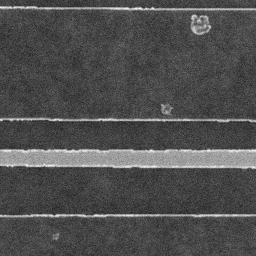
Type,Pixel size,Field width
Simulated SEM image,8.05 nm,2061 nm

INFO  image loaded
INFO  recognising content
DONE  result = lines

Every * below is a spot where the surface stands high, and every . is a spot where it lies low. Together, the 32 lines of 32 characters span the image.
................................
********************************
********************************
********************************
********************************
********************************
********************************
********************************
********************************
********************************
********************************
********************************
********************************
********************************
********************************
................................
................................
................................
................................
********************************
********************************
................................
................................
................................
................................
................................
................................
********************************
********************************
********************************
********************************
********************************